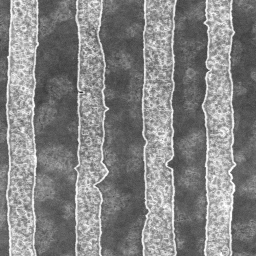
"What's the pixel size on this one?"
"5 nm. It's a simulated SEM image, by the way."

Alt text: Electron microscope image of one or a few lines or trenches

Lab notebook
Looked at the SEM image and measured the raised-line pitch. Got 328 nm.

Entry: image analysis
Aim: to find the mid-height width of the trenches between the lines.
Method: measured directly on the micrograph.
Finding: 204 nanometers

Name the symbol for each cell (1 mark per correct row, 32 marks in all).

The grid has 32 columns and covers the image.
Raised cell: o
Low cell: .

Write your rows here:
.oooo.....ooo.....oooo....ooo...
.oooo.....ooo.....oooo....ooo...
.oooo.....ooo.....oooo....ooo...
.oooo.....oo......oooo....ooo...
.oooo.....oo......oooo....ooo...
.oooo.....ooo.....oooo....ooo...
.ooo......ooo.....oooo....ooo...
.ooo......ooo.....oooo....ooo...
.ooo......ooo.....oooo....ooo...
.ooo......ooo.....oooo....ooo...
.ooo......ooo.....oooo....ooo...
.ooo......ooo.....oooo....ooo...
.ooo......ooo.....ooo.....ooo...
.ooo......ooo.....oooo...oooo...
.ooo......ooo.....oooo....ooo...
.ooo......ooo.....ooo.....ooo...
.ooo......ooo.....oooo....ooo...
.ooo......ooo.....ooo.....ooo...
.ooo......ooo.....oooo....ooo...
.ooo......ooo.....oooo....ooo...
.ooo......ooo.....ooo.....ooo...
.ooo......ooo.....oooo....ooo...
.ooo......ooo.....oooo....ooo...
.ooo......oo......oooo....ooo...
.ooo......ooo.....oooo....ooo...
.ooo......ooo.....oooo....ooo...
.ooo......oo.......ooo....ooo...
.ooo......oo......oooo....ooo...
.ooo......ooo.....oooo....ooo...
.ooo......ooo.....oooo....ooo...
.ooo......oo......oooo....ooo...
.ooo......oo......oooo....ooo...